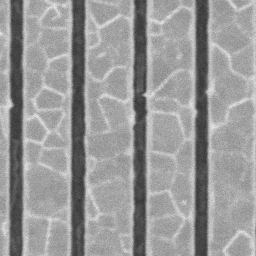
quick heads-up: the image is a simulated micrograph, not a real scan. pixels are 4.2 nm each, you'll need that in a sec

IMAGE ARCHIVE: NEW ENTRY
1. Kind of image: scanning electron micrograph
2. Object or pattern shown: one or a few lines or trenches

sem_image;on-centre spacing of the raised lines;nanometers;260